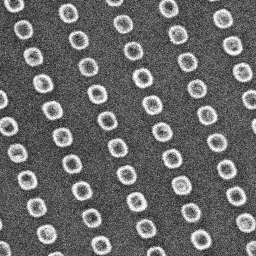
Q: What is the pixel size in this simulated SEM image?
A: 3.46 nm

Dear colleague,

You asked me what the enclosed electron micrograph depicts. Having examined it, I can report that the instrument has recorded a regular array of raised bodies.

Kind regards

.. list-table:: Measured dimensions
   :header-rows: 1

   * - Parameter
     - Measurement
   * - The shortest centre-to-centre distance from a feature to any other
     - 0.0986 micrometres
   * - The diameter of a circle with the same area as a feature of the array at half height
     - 60.2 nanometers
